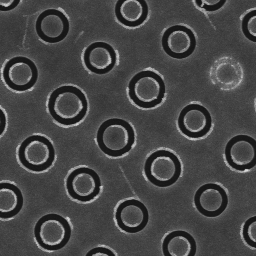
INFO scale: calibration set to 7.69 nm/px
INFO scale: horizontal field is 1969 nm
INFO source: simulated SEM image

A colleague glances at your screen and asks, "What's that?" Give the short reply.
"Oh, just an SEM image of a regular array of ring-shaped grooves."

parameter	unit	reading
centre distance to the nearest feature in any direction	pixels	56.3